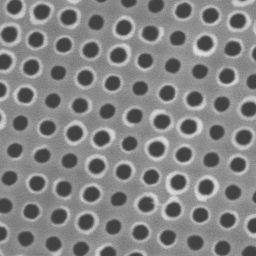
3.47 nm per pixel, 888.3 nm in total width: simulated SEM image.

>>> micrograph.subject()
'a regular array of holes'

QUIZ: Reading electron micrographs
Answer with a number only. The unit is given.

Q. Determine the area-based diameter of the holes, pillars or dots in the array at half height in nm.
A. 49.1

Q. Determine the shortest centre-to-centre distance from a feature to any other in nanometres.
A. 95.7